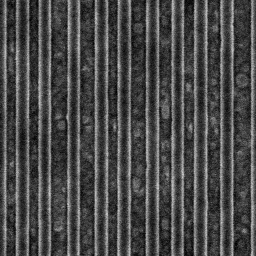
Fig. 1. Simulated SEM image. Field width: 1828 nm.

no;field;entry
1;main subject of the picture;parallel lines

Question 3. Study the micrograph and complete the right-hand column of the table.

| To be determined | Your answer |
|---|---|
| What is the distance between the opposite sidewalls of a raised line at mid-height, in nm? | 91.9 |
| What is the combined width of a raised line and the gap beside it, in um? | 0.182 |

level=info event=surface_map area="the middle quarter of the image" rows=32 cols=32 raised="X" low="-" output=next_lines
-XXX----XXX---XXX----XXX---XXX--
-XXX----XXX---XXX----XXX---XXX--
-XXX----XXX--XXXX----XXX---XXX--
-XXX----XXX---XX-----XXX---XXX--
-XXX----XXX---XXX----XXX---XXX--
-XXX----XXX--XXX-----XXX---XXX--
-XXX----XXX--XXX-----XXX---XXX--
-XXX----XXX--XXX-----XXX---XXX--
-XXX----XXX--XXX-----XXX---XXX--
-XXX----XXX--XXX-----XXX---XXX--
-XXX----XXX--XXXX----XXX---XXX--
-XXX----XXX--XXX-----XXX-X-XXX--
-XXX----XXX---XX-----XXX-X-XXX--
-XXX----XXX---XX-----XXX---XXX--
-XXX----XXX---XX-----XXX---XXX--
-XXX----XXX---XX-----XXX---XXX--
-XXX----XXX---XX-----XXX---XXX--
-XXX----XXX---XX-----XXX---XXX--
-XXX----XXX---XX-----XXX---XXX--
-XXX----XXX---XX-----XXX---XXX--
-XXX----XXX---XX-----XXX---XXX--
-XXX----XXX---XX-----XXX---XXX--
-XXX----XXX---XX-----XXX---XXX--
-XXX----XXX--XXXX----XXX---XXX--
-XXX----XXX--XXXX----XXX---XXX--
-XXX----XXX---XXX----XXX---XXX--
-XXX----XXX---XXX----XXX---XXX--
-XXX----XXX--XXX-----XXX---XXX--
-XXX----XXX--XXX-----XXX---XXX--
-XXX----XXX--XXX-X---XXX---XXX--
-XXX----XXX---XX-X---XXX---XXX--
-XXX----XXX---XX-----XXX---XXX--